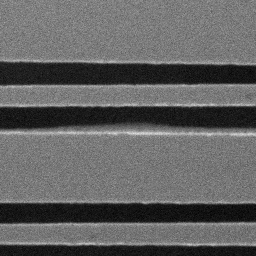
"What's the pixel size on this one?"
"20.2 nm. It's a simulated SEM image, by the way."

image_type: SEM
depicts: lines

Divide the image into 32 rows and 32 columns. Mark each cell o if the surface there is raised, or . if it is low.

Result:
oooooooooooooooooooooooooooooooo
oooooooooooooooooooooooooooooooo
oooooooooooooooooooooooooooooooo
oooooooooooooooooooooooooooooooo
oooooooooooooooooooooooooooooooo
oooooooooooooooooooooooooooooooo
oooooooooooooooooooooooooooooooo
oooooooooooooooooooooooooooooooo
................................
................................
................................
oooooooooooooooooooooooooooooooo
oooooooooooooooooooooooooooooooo
................................
................................
................................
.......oooooooooooooo...........
oooooooooooooooooooooooooooooooo
oooooooooooooooooooooooooooooooo
oooooooooooooooooooooooooooooooo
oooooooooooooooooooooooooooooooo
oooooooooooooooooooooooooooooooo
oooooooooooooooooooooooooooooooo
oooooooooooooooooooooooooooooooo
oooooooooooooooooooooooooooooooo
................................
................................
................................
oooooooooooooooooooooooooooooooo
oooooooooooooooooooooooooooooooo
.ooooooooooooooooooooooooooooooo
................................